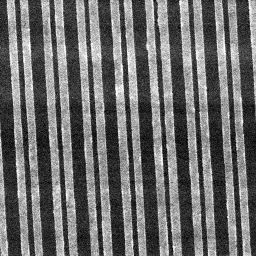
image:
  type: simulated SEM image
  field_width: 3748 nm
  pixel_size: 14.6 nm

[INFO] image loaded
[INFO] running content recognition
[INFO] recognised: parallel lines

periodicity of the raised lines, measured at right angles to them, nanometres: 249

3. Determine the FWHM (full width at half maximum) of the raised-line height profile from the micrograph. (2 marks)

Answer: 110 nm